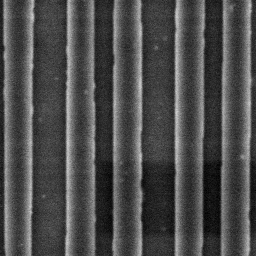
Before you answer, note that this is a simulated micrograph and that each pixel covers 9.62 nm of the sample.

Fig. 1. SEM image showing lines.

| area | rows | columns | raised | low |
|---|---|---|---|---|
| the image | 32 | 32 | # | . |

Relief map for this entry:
.###.....###..####....###...###.
.###.....###..####....###...###.
.###.....###..####....###...###.
.###.....###..####....###...###.
.###.....###..####....###...###.
.###.....###..####....###...###.
.###.....###..####....###...###.
.###.....###..####....###...###.
.###.....###..####....###...###.
.###.....###..####....###...###.
.###.....###..####....###...###.
.###....####..####....###...###.
.###....####..####....###...###.
.###....####..####....###...###.
.###....####..####....###...###.
.###....####..####....###...###.
.###....####..####....###...###.
.###....####..####....###...###.
.###....####..####....###...###.
.###....####..####....###...###.
.###....####..####....###...###.
.###....####..####....###...###.
.###....####..####....###...###.
.###....####..####....###...###.
.###....####..####....###...###.
.###....####..####....###...###.
.###....####..####....###...###.
.###....####..####....###...###.
.###....####..####....###...###.
.###....####..####....###...###.
.###....####..####....###...###.
.###....####..####....###...###.